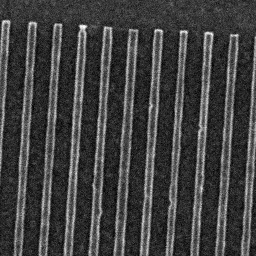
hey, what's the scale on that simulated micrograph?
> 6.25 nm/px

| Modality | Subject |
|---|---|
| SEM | parallel lines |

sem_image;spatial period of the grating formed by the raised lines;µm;0.158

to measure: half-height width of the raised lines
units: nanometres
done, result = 46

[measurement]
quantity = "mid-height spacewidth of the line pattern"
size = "18.4 pixels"